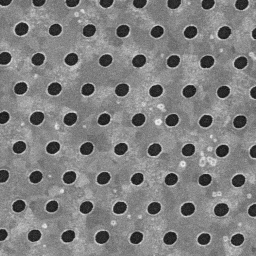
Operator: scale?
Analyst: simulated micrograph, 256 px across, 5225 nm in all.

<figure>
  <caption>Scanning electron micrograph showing a regular array of holes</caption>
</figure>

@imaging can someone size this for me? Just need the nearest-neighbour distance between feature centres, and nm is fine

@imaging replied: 683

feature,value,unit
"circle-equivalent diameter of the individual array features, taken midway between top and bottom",274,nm